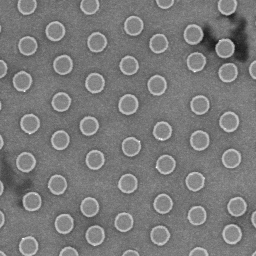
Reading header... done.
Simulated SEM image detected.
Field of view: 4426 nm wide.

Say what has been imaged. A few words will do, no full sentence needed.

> a regular array of raised bodies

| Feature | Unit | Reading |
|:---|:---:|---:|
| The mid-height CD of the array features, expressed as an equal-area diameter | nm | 314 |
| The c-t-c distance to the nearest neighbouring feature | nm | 580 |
